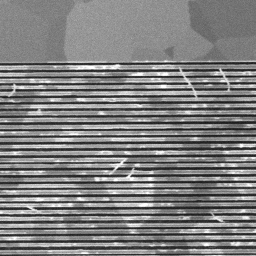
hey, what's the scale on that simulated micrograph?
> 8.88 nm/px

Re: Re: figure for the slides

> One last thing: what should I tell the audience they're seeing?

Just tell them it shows parallel lines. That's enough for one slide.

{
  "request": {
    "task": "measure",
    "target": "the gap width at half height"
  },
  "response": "27.7 nanometers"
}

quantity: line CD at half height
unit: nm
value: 28.8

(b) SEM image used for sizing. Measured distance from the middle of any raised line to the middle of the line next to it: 0.0585 um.